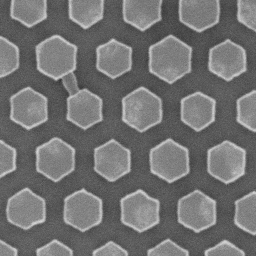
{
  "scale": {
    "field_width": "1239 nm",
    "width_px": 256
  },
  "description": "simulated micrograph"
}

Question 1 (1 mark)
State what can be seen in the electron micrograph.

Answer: a regular array of raised bodies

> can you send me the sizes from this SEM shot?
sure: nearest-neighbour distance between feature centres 56.6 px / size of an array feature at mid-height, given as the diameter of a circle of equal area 0.186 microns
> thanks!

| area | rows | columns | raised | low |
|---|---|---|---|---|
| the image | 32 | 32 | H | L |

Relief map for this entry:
LLHHHHLLLHHHHLLLHHHHLLHHHHHLLLHH
LLHHHHLLLHHHHLLHHHHHLLHHHHHLLLHH
LLHHHLLLLHHHLLLLHHHHLLLHHHHLLLHH
LLLLLLLLLLLLLLLLLHLLLLLLHHLLLLLH
LLLLLLLLLLLLLLLLLLLLLLLLLLLLLLLL
HHLLLHHHHLLLLHHLLLLLHHHLLLLLHLLL
HHLLLHHHHLLLHHHHLLLHHHHHLLHHHHHL
HHLLLHHHHLLLHHHHLLLHHHHHLLHHHHHL
HHLLLHHHHLLLHHHHLLLHHHHHLLHHHHHL
LLLLLLHHHLLLLLHLLLLLHHHLLLLHHLLL
LLLLLLLLHHLLLLLLLLLLLLLLLLLLLLLL
LLHHLLLLLHHLLLLLLHHLLLLLLLLLLLLL
LHHHHHLLLHHHLLLHHHHHLLLHHHHLLLHH
LHHHHHLLLHHHHLLHHHHHLLLHHHHLLLHH
LHHHHHLLLHHHHLLHHHHHLLLHHHHLLLHH
LLLHHLLLLHHHLLLLHHHLLLLHHHLLLLHH
LLLLLLLLLLLLLLLLLLLLLLLLLLLLLLLL
LLLLLLHHLLLLLLLLLLLLLLLLLLLLLLLL
HLLLLHHHHLLLHHHHLLLHHHHLLLLHHHLL
HHLLLHHHHLLLHHHHLLLHHHHLLLHHHHHL
HHLLLHHHHLLLHHHHLLLHHHHHLLHHHHHL
HLLLLHHHHLLLHHHHLLLHHHHLLLHHHHLL
LLLLLLLLLLLLLLLLLLLLLHLLLLLLHLLL
LLLLLLLLLLLLLLLLLLLLLLLLLLLLLLLL
LLHHHLLLLHHHLLLLHHLLLLLHHHLLLLLH
LHHHHLLLHHHHHLLHHHHHLLHHHHHLLLHH
LHHHHHLLHHHHHLLHHHHHLLHHHHHLLLHH
LHHHHLLLHHHHHLLHHHHHLLHHHHHLLHHH
LLLLLLLLLLHLLLLLLHLLLLLLHHLLLLHH
LLLLLLLLLLLLLLLLLLLLLLLLLLLLLLLL
HLLLLLHHLLLLLHLLLLLLHHLLLLLHHLLL
HHLLLHHHHLLLHHHHLLLHHHHLLLHHHHLL